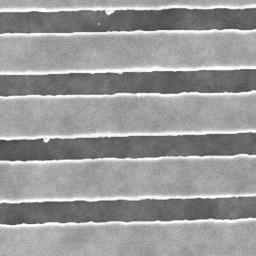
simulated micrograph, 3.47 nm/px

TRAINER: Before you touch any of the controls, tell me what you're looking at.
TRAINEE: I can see lines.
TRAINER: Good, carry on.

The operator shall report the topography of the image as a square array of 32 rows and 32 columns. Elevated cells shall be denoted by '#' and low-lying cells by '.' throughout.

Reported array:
################################
................................
................................
................................
################################
################################
################################
################################
################################
................................
................................
...............................#
################################
################################
################################
################################
################################
................................
................................
.............................###
################################
################################
################################
################################
#############################...
................................
................................
..............................##
################################
################################
################################
################################